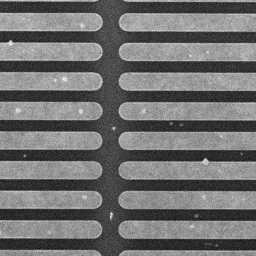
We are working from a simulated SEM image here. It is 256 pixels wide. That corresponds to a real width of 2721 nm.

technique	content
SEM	groups of lines, slits or small figures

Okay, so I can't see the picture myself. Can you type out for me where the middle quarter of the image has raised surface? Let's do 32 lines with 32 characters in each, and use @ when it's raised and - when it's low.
--------------------------------
--------------------------------
@@@@@@@@-------@@@@@@@@@@@@@@@@@
@@@@@@@@@-----@@@@@@@@@@@@@@@@@@
@@@@@@@@@-----@@@@@@@@@@@@@@@@@@
@@@@@@@@@-----@@@@@@@@@@@@@@@@@@
@@@@@@@@-------@@@@@@@@@@@@@@@@@
--------------------------------
--------------------------------
--------------------------------
@@@@@@@@@-----@@@@@@@@@@@@@@@@@@
@@@@@@@@@-----@@@@@@@@@@@@@@@@@@
@@@@@@@@@-----@@@@@@@@@@@@@@@@@@
@@@@@@@@@------@@@@@@@@@@@@@@@@@
--------------------------------
--------------------------------
--------------------------------
@@@@@@@@@------@@@@@@@@@@@@@@@@@
@@@@@@@@@-----@@@@@@@@@@@@@@@@@@
@@@@@@@@@-----@@@@@@@@@@@@@@@@@@
@@@@@@@@@-----@@@@@@@@@@@@@@@@@@
--------------------------------
--------------------------------
--------------------------------
--------------------------------
@@@@@@@@@-----@@@@@@@@@@@@@@@@@@
@@@@@@@@@-----@@@@@@@@@@@@@@@@@@
@@@@@@@@@-----@@@@@@@@@@@@@@@@@@
@@@@@@@@-------@@@@@@@@@@@@@@@@@
--------------------------------
--------------------------------
--------------------------------